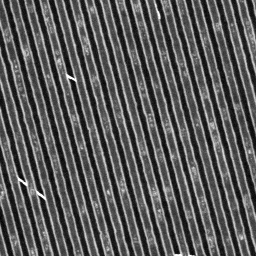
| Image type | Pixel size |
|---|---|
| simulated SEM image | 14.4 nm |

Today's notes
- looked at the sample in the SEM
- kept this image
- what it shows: parallel lines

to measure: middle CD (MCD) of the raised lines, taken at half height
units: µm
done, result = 0.117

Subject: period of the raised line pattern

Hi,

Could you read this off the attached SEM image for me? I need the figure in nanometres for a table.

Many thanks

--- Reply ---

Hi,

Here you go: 212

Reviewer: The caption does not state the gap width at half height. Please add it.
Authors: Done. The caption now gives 92.5 nm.